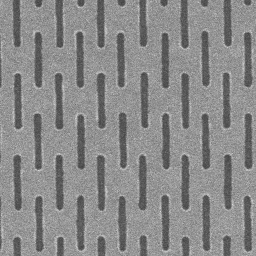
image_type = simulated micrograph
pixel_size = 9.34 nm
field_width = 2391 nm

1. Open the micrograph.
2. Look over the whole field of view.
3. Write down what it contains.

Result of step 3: a regular array of holes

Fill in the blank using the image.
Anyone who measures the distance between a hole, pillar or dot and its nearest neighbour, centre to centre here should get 386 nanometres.